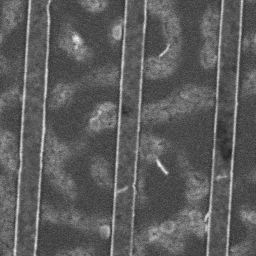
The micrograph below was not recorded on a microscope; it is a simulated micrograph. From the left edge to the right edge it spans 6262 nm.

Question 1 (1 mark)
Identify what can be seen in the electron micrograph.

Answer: one or a few lines or trenches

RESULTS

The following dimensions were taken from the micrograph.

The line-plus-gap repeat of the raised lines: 2340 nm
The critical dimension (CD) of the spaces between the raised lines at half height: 1860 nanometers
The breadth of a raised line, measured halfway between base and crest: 473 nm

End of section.